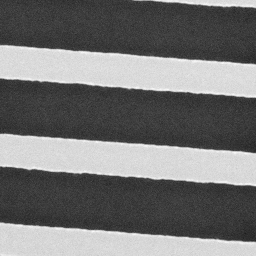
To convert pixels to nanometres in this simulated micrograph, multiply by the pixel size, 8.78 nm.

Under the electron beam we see lines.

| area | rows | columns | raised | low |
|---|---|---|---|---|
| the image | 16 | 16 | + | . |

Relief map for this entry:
................
................
................
+++++++++.......
++++++++++++++++
........++++++++
................
................
++..............
+++++++++++++++.
.+++++++++++++++
..............++
................
................
++++++++........
++++++++++++++++